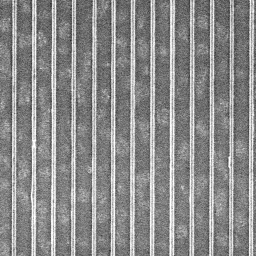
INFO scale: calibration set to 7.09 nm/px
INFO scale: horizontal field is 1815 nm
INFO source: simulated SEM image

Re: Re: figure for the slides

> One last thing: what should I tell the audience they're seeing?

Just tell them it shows parallel lines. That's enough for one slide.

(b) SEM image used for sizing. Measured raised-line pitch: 140 nanometres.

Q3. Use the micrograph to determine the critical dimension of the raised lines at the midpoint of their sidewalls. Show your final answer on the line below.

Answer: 0.0204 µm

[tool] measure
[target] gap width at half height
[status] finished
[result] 17 px